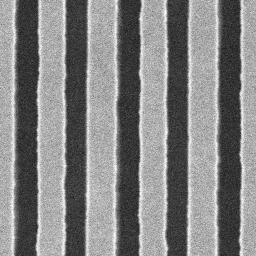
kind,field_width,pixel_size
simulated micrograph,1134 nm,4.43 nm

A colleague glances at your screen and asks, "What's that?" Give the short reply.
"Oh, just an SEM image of lines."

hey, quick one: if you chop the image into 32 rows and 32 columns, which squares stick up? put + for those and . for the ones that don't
++...+++...++++...+++...+++...++
++...+++...++++...+++...+++...++
++...+++...++++...+++...+++...++
++...+++...++++...+++...+++...++
++...+++...++++...+++...+++...++
++...+++...++++...+++...+++...++
++...+++...++++...+++...+++...++
++...+++...++++...+++...+++...++
++...+++...++++...+++...+++...++
++...+++...++++...+++...+++...++
++...+++...++++...+++...+++...++
++...+++...++++...+++...+++...++
++...+++...++++...+++...+++...++
++...+++...+++....+++...+++...++
++...+++...++++...+++...+++...++
++...+++...++++...+++...+++...++
++...+++...++++...+++...+++...++
++...+++...++++...+++...+++...++
++...+++...++++...+++...+++...++
++...+++...+++....+++...+++...++
++...+++...++++...+++...+++...++
++...+++...++++..++++...+++...++
++...+++...+++....+++...+++...++
++...+++...+++....+++...+++...++
++...+++...+++....+++...+++...++
++...+++...+++....+++...+++...++
++...+++...+++...++++...+++...++
++...+++...+++...++++...+++...++
++...+++...++++...+++...+++...++
++...+++...+++....+++...+++...++
++...+++...+++....+++...+++...++
++...+++...+++....+++...+++...++